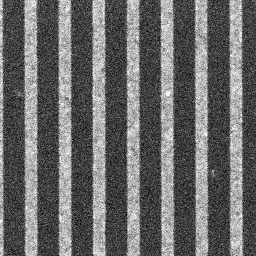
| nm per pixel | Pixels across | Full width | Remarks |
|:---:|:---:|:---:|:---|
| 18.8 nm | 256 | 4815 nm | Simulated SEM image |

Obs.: parallel lines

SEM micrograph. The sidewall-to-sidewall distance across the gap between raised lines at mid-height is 428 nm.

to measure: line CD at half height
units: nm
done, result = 214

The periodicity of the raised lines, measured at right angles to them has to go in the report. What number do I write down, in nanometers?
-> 642